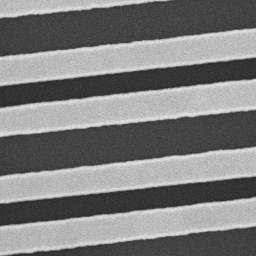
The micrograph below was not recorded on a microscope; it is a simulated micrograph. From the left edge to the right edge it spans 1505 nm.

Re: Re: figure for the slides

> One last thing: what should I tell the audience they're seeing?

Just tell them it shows lines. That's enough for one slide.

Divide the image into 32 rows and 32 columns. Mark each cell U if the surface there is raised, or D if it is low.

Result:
UUUUUUUUUUUUUUUUDDDDDDDDDDDDDDDD
UUUUUUUUDDDDDDDDDDDDDDDDDDDDDDDD
DDDDDDDDDDDDDDDDDDDDDDDDDDDDDDDD
DDDDDDDDDDDDDDDDDDDDDDDDDDDDDDDD
DDDDDDDDDDDDDDDDDDDDDDDDUUUUUUUU
DDDDDDDDDDDDDDUUUUUUUUUUUUUUUUUU
DDDDDDUUUUUUUUUUUUUUUUUUUUUUUUUU
UUUUUUUUUUUUUUUUUUUUUUUUUUUUUDDD
UUUUUUUUUUUUUUUUUUUUDDDDDDDDDDDD
UUUUUUUUUUUDDDDDDDDDDDDDDDDDDDDD
UUUDDDDDDDDDDDDDDDDDDDDDDDUUUUUU
DDDDDDDDDDDDDDDDDUUUUUUUUUUUUUUU
DDDDDDDDDUUUUUUUUUUUUUUUUUUUUUUU
UUUUUUUUUUUUUUUUUUUUUUUUUUUUUUUU
UUUUUUUUUUUUUUUUUUUUUUUUDDDDDDDD
UUUUUUUUUUUUUUUDDDDDDDDDDDDDDDDD
UUUUUDDDDDDDDDDDDDDDDDDDDDDDDDDD
DDDDDDDDDDDDDDDDDDDDDDDDDDDDDDDD
DDDDDDDDDDDDDDDDDDDDDDDDDDDDDDDU
DDDDDDDDDDDDDDDDDDDDDUUUUUUUUUUU
DDDDDDDDDDDDDDUUUUUUUUUUUUUUUUUU
DDDDDUUUUUUUUUUUUUUUUUUUUUUUUUUU
UUUUUUUUUUUUUUUUUUUUUUUUUUUDDDDD
UUUUUUUUUUUUUUUUUUDDDDDDDDDDDDDD
UUUUUUUUUDDDDDDDDDDDDDDDDDDDDDDD
DDDDDDDDDDDDDDDDDDDDDDDDUUUUUUUU
DDDDDDDDDDDDDDDDUUUUUUUUUUUUUUUU
DDDDDDDDUUUUUUUUUUUUUUUUUUUUUUUU
UUUUUUUUUUUUUUUUUUUUUUUUUUUUUDDD
UUUUUUUUUUUUUUUUUUUUUDDDDDDDDDDD
UUUUUUUUUUUUUDDDDDDDDDDDDDDDDDDD
UUUUDDDDDDDDDDDDDDDDDDDDDDDDDDDD